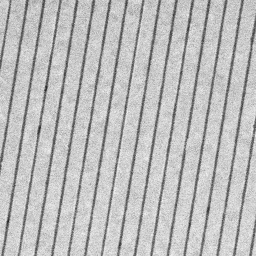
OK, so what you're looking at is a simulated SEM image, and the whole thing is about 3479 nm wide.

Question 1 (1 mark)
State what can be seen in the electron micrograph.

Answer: parallel lines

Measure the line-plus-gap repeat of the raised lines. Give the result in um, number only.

0.222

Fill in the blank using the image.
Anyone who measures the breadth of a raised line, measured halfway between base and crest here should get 0.179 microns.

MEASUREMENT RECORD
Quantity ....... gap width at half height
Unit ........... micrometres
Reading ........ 0.0452